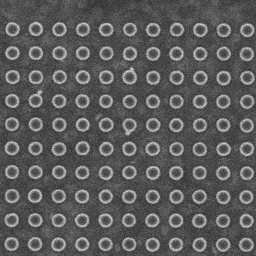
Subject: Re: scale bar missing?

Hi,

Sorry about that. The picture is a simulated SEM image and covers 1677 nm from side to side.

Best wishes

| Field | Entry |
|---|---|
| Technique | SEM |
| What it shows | a regular array of raised bodies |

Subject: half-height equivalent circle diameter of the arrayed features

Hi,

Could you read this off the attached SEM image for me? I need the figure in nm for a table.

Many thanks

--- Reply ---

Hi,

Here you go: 84.7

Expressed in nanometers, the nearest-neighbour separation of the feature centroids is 153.